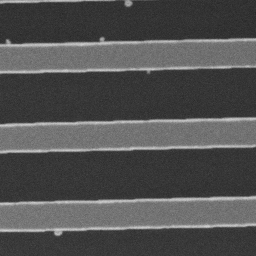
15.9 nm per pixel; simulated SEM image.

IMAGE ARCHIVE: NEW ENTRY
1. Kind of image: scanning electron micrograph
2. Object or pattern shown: lines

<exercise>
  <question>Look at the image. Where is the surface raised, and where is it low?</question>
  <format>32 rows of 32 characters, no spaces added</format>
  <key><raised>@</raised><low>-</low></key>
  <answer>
--------------------------------
--------------------------------
--------------------------------
--------------------------------
--------------------------------
---@@@@@@@@@@@@@@@@@@@@@@@@@@@@@
@@@@@@@@@@@@@@@@@@@@@@@@@@@@@@@@
@@@@@@@@@@@@@@@@@@@@@@@@@@@@@@@@
@@@@@@@@@@@@@@@@@@@@@@@@--------
--------------------------------
--------------------------------
--------------------------------
--------------------------------
--------------------------------
--------------------------------
-@@@@@@@@@@@@@@@@@@@@@@@@@@@@@@@
@@@@@@@@@@@@@@@@@@@@@@@@@@@@@@@@
@@@@@@@@@@@@@@@@@@@@@@@@@@@@@@@@
@@@@@@@@@@@@@@@@@@@@@@@@@@------
--------------------------------
--------------------------------
--------------------------------
--------------------------------
--------------------------------
--------------------------------
@@@@@@@@@@@@@@@@@@@@@@@@@@@@@@@@
@@@@@@@@@@@@@@@@@@@@@@@@@@@@@@@@
@@@@@@@@@@@@@@@@@@@@@@@@@@@@@@@@
@@@@@@@@@@@@@@@@@@@-------------
--------------------------------
--------------------------------
--------------------------------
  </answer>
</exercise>